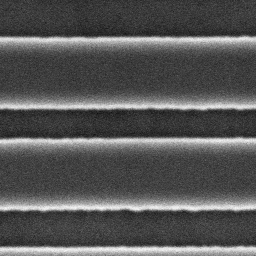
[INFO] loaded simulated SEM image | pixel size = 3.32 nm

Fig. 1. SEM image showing lines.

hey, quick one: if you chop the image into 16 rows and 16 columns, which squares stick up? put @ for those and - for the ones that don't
----------------
----------------
@@@@@@@@@@@@@@@@
@@@@@@@@@@@@@@@@
@@@@@@@@@@@@@@@@
@@@@@@@@@@@@@@@@
@@@@@@@@@@@@@@@@
----------------
----------------
@@@@@@@@@@@@@@@@
@@@@@@@@@@@@@@@@
@@@@@@@@@@@@@@@@
@@@@@@@@@@@@@@@@
----------------
----------------
----------------